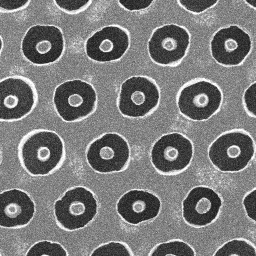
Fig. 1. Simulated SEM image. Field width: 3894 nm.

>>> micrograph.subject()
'a regular array of ring-shaped grooves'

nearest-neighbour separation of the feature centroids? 920 nm